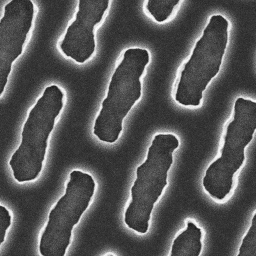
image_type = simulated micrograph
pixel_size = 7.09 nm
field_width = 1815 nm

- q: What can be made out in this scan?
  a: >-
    holes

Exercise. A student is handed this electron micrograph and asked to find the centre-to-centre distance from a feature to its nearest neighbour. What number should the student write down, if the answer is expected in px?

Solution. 89.8